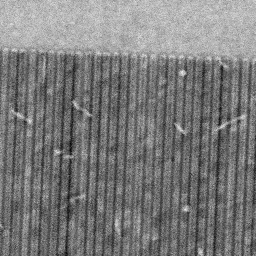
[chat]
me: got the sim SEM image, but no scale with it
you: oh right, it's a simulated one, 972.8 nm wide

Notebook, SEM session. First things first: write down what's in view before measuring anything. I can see parallel lines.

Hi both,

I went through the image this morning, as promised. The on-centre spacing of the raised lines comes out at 35.3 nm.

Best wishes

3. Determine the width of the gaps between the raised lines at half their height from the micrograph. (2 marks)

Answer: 14.7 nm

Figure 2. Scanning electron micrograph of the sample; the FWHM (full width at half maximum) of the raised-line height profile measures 18.5 nanometres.